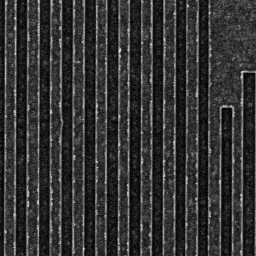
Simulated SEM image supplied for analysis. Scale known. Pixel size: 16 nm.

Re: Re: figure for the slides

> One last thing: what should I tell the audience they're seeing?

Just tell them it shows parallel lines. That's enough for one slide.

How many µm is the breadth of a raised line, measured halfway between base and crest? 0.188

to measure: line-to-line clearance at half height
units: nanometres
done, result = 172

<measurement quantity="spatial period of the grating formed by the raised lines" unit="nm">364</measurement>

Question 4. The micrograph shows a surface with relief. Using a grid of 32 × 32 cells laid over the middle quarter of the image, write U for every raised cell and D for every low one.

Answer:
DDUUUDDDUUUDDDUUDDDUUUDDDUUUDDDU
DDUUUDDDUUUDDDUUDDDUUUDDDUUUDDDU
DDUUUDDDUUUDDDUUDDDUUUDDDUUUDDDU
DDUUUDDDUUUDDDUUDDDUUUDDDUUUDDDU
DDUUUDDDUUUDDDUUDDDUUUDDDUUUDDDU
DDUUUDDDUUUDDDUUDDDUUUDDDUUUDDDU
DDUUUDDDUUUDDDUUDDDUUUDDDUUUDDDU
DDUUUDDDUUUDDDUUDDDUUUDDDUUUDDDU
DDUUUDDDUUUDDDUUDDDUUUDDDUUUDDDU
DDUUUDDDUUUDDDUUDDDUUUDDDUUUDDDU
DDUUUDDDUUUDDDUUDDDUUUDDDUUUDDDU
DDUUUDDDUUUDDDUUDDDUUUDDDUUUDDDU
DDUUUDDDUUUDDDUUDDDUUUDDDUUUDDDU
DDUUUDDDUUUDDDUUDDDUUUDDDUUUDDDU
DDUUUDDDUUUDDDUUDDDUUUDDDUUUDDDU
DDUUUDDDUUUDDDUUDDDUUUDDDUUUDDDU
DDUUUDDDUUUDDDUUDDDUUUDDDUUUDDDU
DDUUUDDDUUUDDDUUDDDUUUDDDUUUDDDU
DDUUUDDDUUUDDDUUDDDUUUDDDUUUDDDU
DDUUUDDDUUUDDDUUDDDUUUDDDUUUDDDU
DDUUUDDDUUUDDDUUDDDUUUDDDUUUDDDU
DDUUUDDDUUUDDDUUDDDUUUDDDUUUDDDU
DDUUUDDDUUUDDDUUDDDUUUDDDUUUDDDU
DDUUUDDDUUUDDDUUDDDUUUDDDUUUDDDU
DDUUUDDDUUUDDDUUDDDUUUDDDUUUDDDU
DDUUUDDDUUDDDDUUDDDUUUDDDUUUDDDU
DDUUUDDDUUDDDDUUDDDUUUDDDUUUDDDU
DDUUUDDDUUDDDDUUDDDUUUDDDUUUDDDU
DDUUUDDDUUDDDDUUDDDUUUDDDUUUDDDU
DDUUUDDDUUDDDDUUDDDUUUDDDUUUDDDU
DDUUUDDDUUDDDDUUDDDUUUDDDUUUDDDU
DDUUUDDDUUDDDDUUDDDUUUDDDUUUDDDU